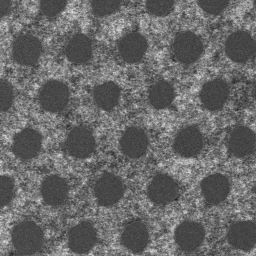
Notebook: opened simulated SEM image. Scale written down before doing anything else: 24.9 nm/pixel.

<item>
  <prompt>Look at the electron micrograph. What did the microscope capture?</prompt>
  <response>a regular array of raised bodies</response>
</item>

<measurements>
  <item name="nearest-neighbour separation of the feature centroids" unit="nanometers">1320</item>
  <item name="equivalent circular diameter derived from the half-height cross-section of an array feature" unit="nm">767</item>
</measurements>